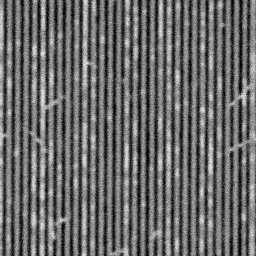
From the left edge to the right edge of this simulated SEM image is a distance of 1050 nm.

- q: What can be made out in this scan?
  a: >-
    parallel lines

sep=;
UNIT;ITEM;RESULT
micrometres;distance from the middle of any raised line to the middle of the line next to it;0.0344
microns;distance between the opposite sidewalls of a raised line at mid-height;0.0195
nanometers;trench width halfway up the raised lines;15.4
